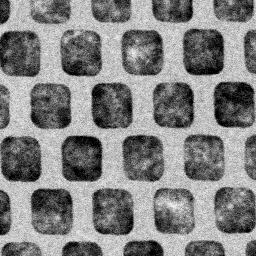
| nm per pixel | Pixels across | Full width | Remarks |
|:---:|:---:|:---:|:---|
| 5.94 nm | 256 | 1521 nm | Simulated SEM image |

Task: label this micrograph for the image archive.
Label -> a regular array of holes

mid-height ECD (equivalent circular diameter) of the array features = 282 nm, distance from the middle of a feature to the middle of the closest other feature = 361 nm